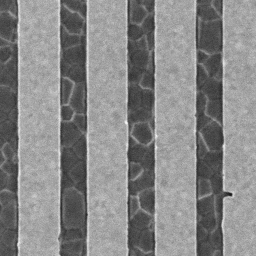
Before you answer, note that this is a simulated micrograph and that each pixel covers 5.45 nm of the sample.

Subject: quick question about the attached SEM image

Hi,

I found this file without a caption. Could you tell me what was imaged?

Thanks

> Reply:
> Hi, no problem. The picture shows one or a few lines or trenches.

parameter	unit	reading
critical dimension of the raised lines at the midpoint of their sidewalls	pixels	39.7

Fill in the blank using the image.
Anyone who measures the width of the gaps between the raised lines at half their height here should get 28.1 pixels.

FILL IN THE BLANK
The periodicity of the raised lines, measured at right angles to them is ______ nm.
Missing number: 371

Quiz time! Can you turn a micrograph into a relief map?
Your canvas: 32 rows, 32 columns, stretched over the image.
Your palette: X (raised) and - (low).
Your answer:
--XXXXX----XXXXX---XXXXX----XXXX
--XXXXX----XXXXX---XXXXX----XXXX
--XXXXX----XXXXX---XXXXX----XXXX
--XXXXX----XXXXX----XXXXX---XXXX
--XXXXX----XXXXX---XXXXXX-X-XXXX
--XXXXX----XXXXX----XXXX----XXXX
--XXXXX----XXXXX---XXXXX----XXXX
--XXXXX----XXXXX---XXXXX----XXXX
--XXXXX----XXXXX----XXXX----XXXX
--XXXXX----XXXXX---XXXXX----XXXX
--XXXXX----XXXXX----XXXX----XXXX
--XXXXX----XXXXX----XXXX----XXXX
--XXXXX----XXXXX---XXXXX----XXXX
--XXXXX----XXXXX---XXXXX----XXXX
--XXXXX----XXXXX----XXXX----XXXX
--XXXXX----XXXXX----XXXX----XXXX
--XXXXX----XXXXX---XXXXX----XXXX
--XXXXX----XXXXX----XXXX----XXXX
--XXXXX----XXXXX---XXXXX----XXXX
--XXXXX----XXXXX---XXXXX----XXXX
--XXXXX----XXXXX----XXXX----XXXX
--XXXXX----XXXXX---XXXXX----XXXX
--XXXXX----XXXXX----XXXX----XXXX
--XXXXX----XXXXX---XXXXX----XXXX
--XXXXX----XXXXX----XXXX-----XXX
--XXXXXXXX-XXXXX----XXXX----XXXX
-XXXXXXXXX-XXXXX----XXXX----XXXX
--XXXXXX---XXXXX----XXXX----XXXX
--XXXXX----XXXXX----XXXX----XXXX
--XXXXX----XXXXX---XXXXX----XXXX
--XXXXX----XXXXX----XXXX----XXXX
--XXXXX----XXXXX---XXXXXX---XXXX